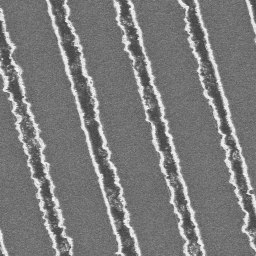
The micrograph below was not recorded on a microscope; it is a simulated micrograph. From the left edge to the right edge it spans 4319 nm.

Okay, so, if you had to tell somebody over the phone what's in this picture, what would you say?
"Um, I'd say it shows one or a few lines or trenches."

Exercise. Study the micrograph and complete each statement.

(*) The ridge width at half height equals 261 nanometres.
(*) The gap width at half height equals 0.803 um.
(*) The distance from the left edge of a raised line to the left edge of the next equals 1070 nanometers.